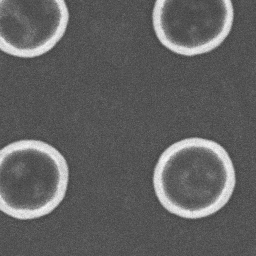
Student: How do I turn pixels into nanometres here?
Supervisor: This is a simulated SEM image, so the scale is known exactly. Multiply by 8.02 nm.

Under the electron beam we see raised bodies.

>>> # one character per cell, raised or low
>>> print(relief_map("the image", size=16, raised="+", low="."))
++++......++++..
++++......++++..
+++.......++++..
................
................
................
................
................
................
+++........+++..
++++......++++..
++++......++++..
++++......++++..
................
................
................